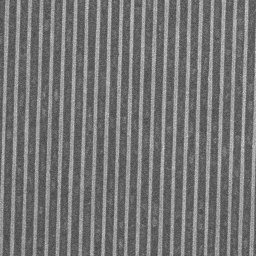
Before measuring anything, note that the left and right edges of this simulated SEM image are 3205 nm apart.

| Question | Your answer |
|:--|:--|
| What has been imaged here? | parallel lines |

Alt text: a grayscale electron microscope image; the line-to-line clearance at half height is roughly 0.111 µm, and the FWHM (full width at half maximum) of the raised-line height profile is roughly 34.4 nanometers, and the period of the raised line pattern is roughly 0.143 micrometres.